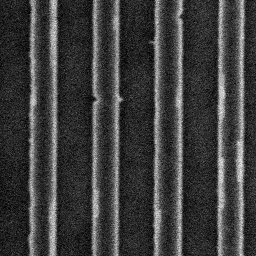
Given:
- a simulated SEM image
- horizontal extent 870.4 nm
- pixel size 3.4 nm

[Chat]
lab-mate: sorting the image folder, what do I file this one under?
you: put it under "one or a few lines or trenches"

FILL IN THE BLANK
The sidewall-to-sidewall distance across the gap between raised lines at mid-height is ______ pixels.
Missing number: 38.1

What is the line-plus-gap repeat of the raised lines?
212 nm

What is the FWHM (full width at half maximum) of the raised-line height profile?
79.9 nm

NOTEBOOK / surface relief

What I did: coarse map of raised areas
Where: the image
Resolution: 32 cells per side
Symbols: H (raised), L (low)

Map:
LLLLHHHLLLLLHHHLLLLLHHHLLLLLHHLL
LLLLHHHLLLLLHHHLLLLLHHHLLLLHHHLL
LLLLHHHLLLLLHHHLLLLLHHLLLLLHHHLL
LLLLHHHLLLLLHHHLLLLLHHHLLLLHHHLL
LLLLHHHLLLLLHHHLLLLLHHHLLLLHHHLL
LLLLHHHLLLLLHHHLLLLHHHHLLLLHHHLL
LLLLHHHLLLLLHHHLLLLLHHHLLLLHHHLL
LLLLHHHLLLLLHHHLLLLLHHHLLLLHHHLL
LLLLHHHLLLLLHHHLLLLLHHHLLLLHHHLL
LLLLHHHLLLLLHHHLLLLLHHHLLLLHHHLL
LLLLHHHLLLLLHHHLLLLLHHHLLLLHHHLL
LLLLHHHLLLLLHHHLLLLLHHHLLLLHHHLL
LLLLHHHLLLLLHHHLLLLLHHHLLLLHHHLL
LLLLHHHLLLLLHHHLLLLLHHHLLLLHHHLL
LLLLHHHLLLLLHHHLLLLLHHHLLLLHHHLL
LLLLHHHLLLLLHHHLLLLLHHHLLLLHHHLL
LLLLHHHLLLLLHHHLLLLHHHHLLLLHHHLL
LLLLHHHLLLLLHHHLLLLHHHHLLLLHHHLL
LLLLHHHLLLLLHHHLLLLHHHHLLLLHHHLL
LLLLHHHLLLLLHHHLLLLHHHHLLLLHHHLL
LLLLHHHLLLLLHHHLLLLHHHHLLLLHHHLL
LLLLHHHLLLLLHHHLLLLHHHHLLLLHHHLL
LLLLHHHLLLLLHHHLLLLHHHHLLLLHHHLL
LLLLHHHLLLLLHHHLLLLHHHHLLLLHHHLL
LLLLHHHLLLLLHHHLLLLHHHHLLLLHHHLL
LLLLHHHLLLLLHHHLLLLHHHHLLLLHHHLL
LLLLHHHLLLLLHHHLLLLHHHHLLLLHHHLL
LLLLHHHLLLLLHHHLLLLHHHHLLLLHHHLL
LLLLHHHLLLLLHHHLLLLHHHHLLLLHHHLL
LLLLHHHLLLLLHHHLLLLHHHLLLLLLHHLL
LLLLHHHLLLLLHHHLLLLHHHLLLLLHHHLL
LLLLHHHLLLLLHHHLLLLHHHLLLLLHHHLL